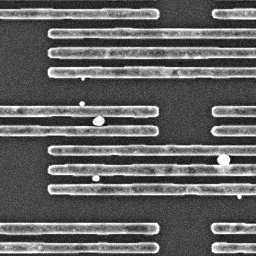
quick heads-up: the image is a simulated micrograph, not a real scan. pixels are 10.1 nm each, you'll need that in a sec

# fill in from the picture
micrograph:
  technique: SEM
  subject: wiring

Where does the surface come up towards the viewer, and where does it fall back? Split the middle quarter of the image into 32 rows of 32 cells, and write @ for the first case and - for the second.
--------------------------------
@@@@@@@@@@@@@@@@@@@@@@@@@@@@@@@@
@@@@@@@@@@@@@@@@@@@@@@@@@@@@@@@@
--------------------------------
--------------------------------
--------------------------------
--------------------------------
--------------------------------
--------------------------------
--------------------------------
----@---------------------------
@@@@@@@@@@@@@@@@@@@@@@@---------
@@@@@@@@@@@@@@@@@@@@@@@---------
--------@@----------------------
--------@@----------------------
--------@-----------------------
@@@@@@@@@@@@@@@@@@@@@@@---------
@@@@@@@@@@@@@@@@@@@@@@@---------
--------------------------------
--------------------------------
--------------------------------
@@@@@@@@@@@@@@@@@@@@@@@@@@@@@@@@
@@@@@@@@--------@@@@@@@@@@@@@@@@
--------------------------------
--------------------------------
@@@@@@@@@@@@@@@@@@@@@@@@@@@@@@@@
@@@@@@@@@@@@@@@@@@@@@@@@@@@@@@@@
@@@@@@@@@@@@@@@@@@@@@@@@@@@@@@@@
-------@@-----------------------
--------------------------------
@@@@@@@@@@@@@@@@@@@@@@@@@@@@@@@@
@@@@@@@@@@@@@@@@@@@@@@@@@@@@@@@@